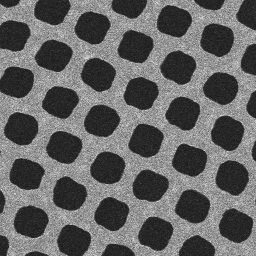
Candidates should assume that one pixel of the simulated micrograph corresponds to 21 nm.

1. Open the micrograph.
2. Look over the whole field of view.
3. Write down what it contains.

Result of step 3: a regular array of holes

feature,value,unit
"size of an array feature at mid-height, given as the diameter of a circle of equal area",704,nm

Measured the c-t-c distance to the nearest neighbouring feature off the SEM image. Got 961 nm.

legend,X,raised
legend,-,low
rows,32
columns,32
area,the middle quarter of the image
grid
-XXXX-------XXXXXXXXXXXX--------
XXXXX--------XXXXXXXXXXX--------
XXXX---------XXXXXXXXXXXX-------
XXXX---------XXXXX--XXXXX-------
XXXXX-------XXXX------XXXXXX---X
XXXXXX------XXXX-------XXXXXXXXX
--XXXXXX---XXXX---------XXXXXXXX
---XXXXXXXXXXXX---------XXXXXXXX
----XXXXXXXXXXX--------XXXXX---X
----XXXXXXXXXXX--------XXXX-----
---XXXX----XXXXXX-----XXXX------
--XXXX-------XXXXXXXXXXXXX------
--XXXX-------XXXXXXXXXXXX-------
-XXXX---------XXXXXXXXXXX-------
XXXXX---------XXXXXXXXXXXX------
XXXXX--------XXXXX----XXXXXX----
XXXXX--------XXXX-------XXXXXX-X
--XXXXX-----XXXXX--------XXXXXXX
----XXXXXXXXXXXXX--------XXXXXXX
----XXXXXXXXXXXX---------XXXXXXX
-----XXXXXXXXXXX--------XXXXX---
----XXXXXXXXXXXXX-------XXXX----
----XXXXX----XXXXX-----XXXXX----
---XXXXX-------XXXXXXXXXXXX-----
--XXXXX--------XXXXXXXXXXXX-----
XXXXXXX--------XXXXXXXXXXXX-----
XXXXXXX--------XXXXX-XXXXXXX----
XXXXXXX--------XXXX-----XXXXXX--
--XXXXX-------XXXX--------XXXXXX
---XXXXXX----XXXX---------XXXXXX
-----XXXXXXXXXXXX---------XXXXXX
------XXXXXXXXXXX---------XXXXX-